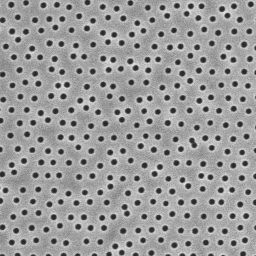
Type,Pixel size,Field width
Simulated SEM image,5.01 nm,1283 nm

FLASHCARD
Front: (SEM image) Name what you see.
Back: a regular array of holes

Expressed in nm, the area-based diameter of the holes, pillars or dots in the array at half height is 29.4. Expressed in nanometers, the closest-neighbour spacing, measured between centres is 60.4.